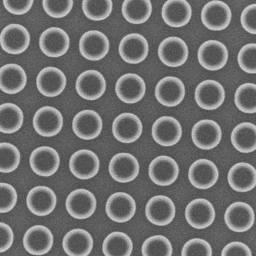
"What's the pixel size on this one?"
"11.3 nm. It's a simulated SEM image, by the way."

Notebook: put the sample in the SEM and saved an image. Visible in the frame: an array of small figures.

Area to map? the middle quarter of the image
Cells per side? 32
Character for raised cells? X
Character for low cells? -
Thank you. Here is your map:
--------------------------XX----
--------------------------------
----XXXXX-------X---------------
----XXXXXX----XXXXX------XXX----
---XXXXXXX---XXXXXXX----XXXXX---
---XXXXXXX---XXXXXXX---XXXXXXX--
---XXXXXXX---XXXXXXX---XXXXXXX--
----XXXXXX---XXXXXXX---XXXXXXX--
-----XXX------XXXXX----XXXXXXX--
---------------XXX------XXXXX---
--------------------------X-----
--------------------------------
---XXXXX-------XX---------------
---XXXXXX----XXXXXX-----XXX-----
--XXXXXXX---XXXXXXX----XXXXXX---
--XXXXXXX---XXXXXXX---XXXXXXX---
--XXXXXXX---XXXXXXX---XXXXXXX---
---XXXXXX---XXXXXXX---XXXXXXX---
----XXX------XXXXX----XXXXXXX---
--------------XXX------XXXXX----
--------------------------------
----X---------------------------
--XXXXXX-----XXX----------------
--XXXXXX----XXXXXX-----XXXX-----
-XXXXXXXX---XXXXXX----XXXXXX----
-XXXXXXXX--XXXXXXXX--XXXXXXX----
--XXXXXXX--XXXXXXXX--XXXXXXXX--X
--XXXXXX----XXXXXX---XXXXXXX---X
----XX------XXXXXX----XXXXXX---X
--------------XX------XXXXX-----
--------------------------------
---XX---------------------------